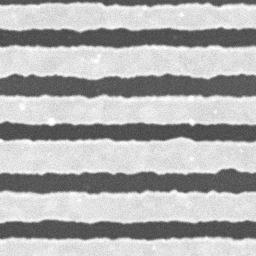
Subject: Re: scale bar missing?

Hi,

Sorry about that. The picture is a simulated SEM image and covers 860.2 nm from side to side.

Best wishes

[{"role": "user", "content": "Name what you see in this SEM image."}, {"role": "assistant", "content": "lines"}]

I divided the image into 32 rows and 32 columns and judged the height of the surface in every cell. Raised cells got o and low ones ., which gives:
.....oooooooo...........oo....o.
oooooooooooooooooooooooooooooooo
oooooooooooooooooooooooooooooooo
ooooooooooooooo.oooo.oooooo.ooo.
................................
................................
oooooooooooooooooooooooooooooooo
oooooooooooooooooooooooooooooooo
oooooooooooooooooooooooooooooooo
o.......oooooo.oo......oooo.....
................................
................................
oooooooooooooooooooooooooooooooo
oooooooooooooooooooooooooooooooo
oooooooooooooooooooooooooooooooo
...oooo..ooo.oo.....o....oo..ooo
................................
..oo......oooo.......ooo........
oooooooooooooooooooooooooooooooo
oooooooooooooooooooooooooooooooo
oooooooooooooooooooooooooooooooo
oooooooooooo.oooo..oooooooo....o
................................
................................
oooooooooooooooooooooooooooooooo
oooooooooooooooooooooooooooooooo
oooooooooooooooooooooooooooooooo
oooooo.ooooooooooooooooooooooooo
................................
................................
oooooooooooooooooooooooooooooooo
oooooooooooooooooooooooooooooooo